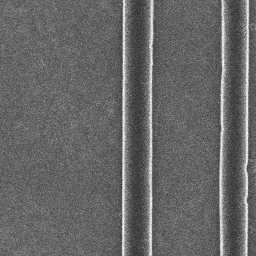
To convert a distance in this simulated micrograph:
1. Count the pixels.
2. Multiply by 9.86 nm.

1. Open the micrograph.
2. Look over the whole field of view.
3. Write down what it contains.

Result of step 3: one or a few lines or trenches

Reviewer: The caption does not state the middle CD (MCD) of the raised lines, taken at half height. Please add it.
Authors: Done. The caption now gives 268 nanometres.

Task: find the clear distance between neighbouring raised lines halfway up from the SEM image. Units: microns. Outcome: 0.698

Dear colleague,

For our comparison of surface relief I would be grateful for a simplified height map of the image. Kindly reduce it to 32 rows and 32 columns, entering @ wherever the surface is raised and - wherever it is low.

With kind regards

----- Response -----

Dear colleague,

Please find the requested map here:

---------------@@@@---------@@@-
---------------@@@@---------@@@-
---------------@@@@---------@@@-
---------------@@@@---------@@@-
---------------@@@@---------@@@-
---------------@@@@---------@@@-
---------------@@@@---------@@@-
---------------@@@@---------@@@-
---------------@@@@---------@@@-
---------------@@@@---------@@@-
---------------@@@@---------@@@-
---------------@@@@---------@@@-
---------------@@@@---------@@@-
---------------@@@@---------@@@-
---------------@@@@---------@@@-
---------------@@@@---------@@@-
---------------@@@@---------@@@-
---------------@@@@---------@@@-
---------------@@@@---------@@@-
---------------@@@@---------@@@-
---------------@@@@---------@@@-
---------------@@@@---------@@@-
---------------@@@@---------@@@-
---------------@@@@---------@@@-
---------------@@@@---------@@@-
---------------@@@@---------@@@-
---------------@@@@---------@@@-
---------------@@@@---------@@@-
---------------@@@@---------@@@-
---------------@@@@---------@@@-
---------------@@@@---------@@@-
---------------@@@@---------@@@-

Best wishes